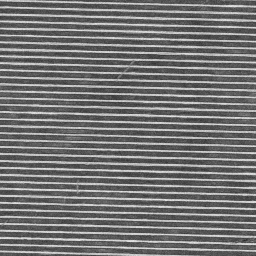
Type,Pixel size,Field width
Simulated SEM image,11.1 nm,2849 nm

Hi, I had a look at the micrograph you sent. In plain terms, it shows parallel lines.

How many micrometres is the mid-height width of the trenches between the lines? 0.0598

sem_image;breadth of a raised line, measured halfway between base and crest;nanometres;16.7